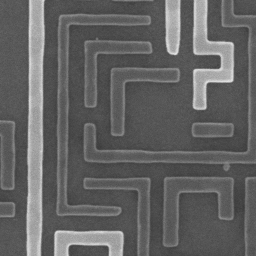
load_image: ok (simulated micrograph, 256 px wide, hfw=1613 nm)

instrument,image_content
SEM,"wiring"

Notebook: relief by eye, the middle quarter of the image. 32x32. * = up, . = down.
*....***........................
*....***....*****************...
*....***....*****************...
*....***....*****************...
*....***....****................
*....***....***.................
*....***....***.................
*....***....***.................
*....***....***.................
*....***....***.................
*.....**....***.................
*...........***.................
*...........***.................
*...........***.................
*...........***.................
*....***....***.................
*....***....***.................
*....***....***.................
*....***........................
*....***........................
*....***........................
*....****.......................
*....***************************
*....***************************
*.......*****....******..*******
*...............................
*...............................
*...............................
*........................*******
*....****************....*******
.....****************....*******
..................***....*******